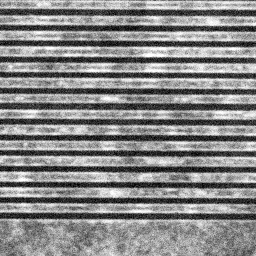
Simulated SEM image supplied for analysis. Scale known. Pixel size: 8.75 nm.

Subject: parallel lines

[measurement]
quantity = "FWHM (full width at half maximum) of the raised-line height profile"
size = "8.63 pixels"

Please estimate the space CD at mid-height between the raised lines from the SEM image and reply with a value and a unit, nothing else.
59.1 nanometers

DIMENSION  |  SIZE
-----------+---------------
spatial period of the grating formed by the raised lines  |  137 nanometers